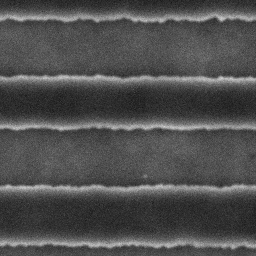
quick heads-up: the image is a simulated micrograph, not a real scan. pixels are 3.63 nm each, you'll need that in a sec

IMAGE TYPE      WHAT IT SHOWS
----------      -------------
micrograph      lines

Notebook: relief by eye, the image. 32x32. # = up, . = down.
################################
################################
..#.....#...#....####...#.......
................................
................................
................................
................................
................................
................................
........#...#...................
################################
################################
################################
################################
################################
################################
................................
................................
................................
................................
................................
................................
................................
###############.###########.####
################################
################################
################################
################################
################################
################################
######.################.########
................................